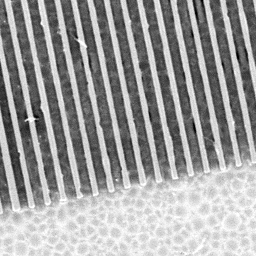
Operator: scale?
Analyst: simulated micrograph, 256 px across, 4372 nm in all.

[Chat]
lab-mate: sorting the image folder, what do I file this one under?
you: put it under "parallel lines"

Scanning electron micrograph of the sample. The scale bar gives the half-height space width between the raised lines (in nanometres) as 188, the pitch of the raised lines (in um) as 0.276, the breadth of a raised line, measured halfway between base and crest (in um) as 0.0879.